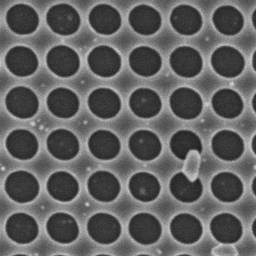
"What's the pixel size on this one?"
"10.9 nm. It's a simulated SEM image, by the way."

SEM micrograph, a regular array of holes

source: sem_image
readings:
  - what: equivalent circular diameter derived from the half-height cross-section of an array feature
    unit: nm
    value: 358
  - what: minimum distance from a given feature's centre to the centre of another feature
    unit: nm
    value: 446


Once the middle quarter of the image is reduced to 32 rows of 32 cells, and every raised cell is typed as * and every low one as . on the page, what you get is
....**........**.........**.....
....***.......***.......***.....
...*****.....*****.....*****....
*********..*******************..
********************************
********************************
..*****.....******....******....
...***.......****......****.....
....**........**........**......
....**........**.........*......
....**........**.........*......
....**........***.......***.....
...****......****.......***.....
..*******...*******...*******...
********************************
********************************
.*******...********..********..*
..*****......****......****.....
...***........**........***.....
....**........**........**......
....**........**........**......
....**........**........***.....
...****.......***.......***....*
...*****.....*****.....*****...*
********************************
********************************
*********.**********************
..*****.....******....******..**
...***.......***.......****....*
...***........**........**......
....**........**........**......
....**........**........**......